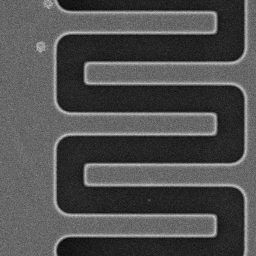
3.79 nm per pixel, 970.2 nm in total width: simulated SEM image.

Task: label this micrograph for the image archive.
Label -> groups of lines, slits or small figures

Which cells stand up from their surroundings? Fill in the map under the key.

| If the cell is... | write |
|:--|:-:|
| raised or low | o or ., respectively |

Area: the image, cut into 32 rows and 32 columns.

ooooooo........................o
ooooooooooooooooooooooooooo....o
ooooooooooooooooooooooooooo....o
ooooooooooooooooooooooooooo....o
oooooooo.......................o
ooooooo........................o
ooooooo.......................oo
ooooooo.......................oo
ooooooo....ooooooooooooooooooooo
ooooooo....ooooooooooooooooooooo
ooooooo....ooooooooooooooooooooo
ooooooo.......................oo
ooooooo........................o
oooooooo.......................o
ooooooooooooooooooooooooooo....o
ooooooooooooooooooooooooooo....o
ooooooooooooooooooooooooooo....o
oooooooo.......................o
ooooooo........................o
ooooooo.......................oo
ooooooo....ooooooooooooooooooooo
ooooooo....ooooooooooooooooooooo
ooooooo....ooooooooooooooooooooo
ooooooo.......................oo
ooooooo.......................oo
ooooooo........................o
oooooooo.......................o
ooooooooooooooooooooooooooo....o
ooooooooooooooooooooooooooo....o
ooooooooooooooooooooooooooo....o
ooooooo........................o
ooooooo........................o